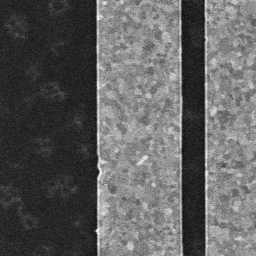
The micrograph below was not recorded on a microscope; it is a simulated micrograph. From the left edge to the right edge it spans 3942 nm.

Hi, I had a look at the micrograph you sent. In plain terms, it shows one or a few lines or trenches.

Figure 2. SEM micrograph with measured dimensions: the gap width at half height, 387 nm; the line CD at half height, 82.8 px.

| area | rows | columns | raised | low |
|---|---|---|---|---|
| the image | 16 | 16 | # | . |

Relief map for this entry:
......#####..###
......#####..###
......#####..###
......#####..###
......#####..###
......#####..###
......#####..###
......#####..###
......#####..###
......#####..###
......#####..###
......#####..###
......#####..###
......#####..###
......#####..###
......#####..###